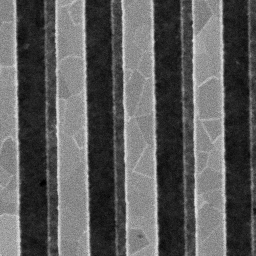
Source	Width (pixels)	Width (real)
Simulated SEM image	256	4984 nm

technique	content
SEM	lines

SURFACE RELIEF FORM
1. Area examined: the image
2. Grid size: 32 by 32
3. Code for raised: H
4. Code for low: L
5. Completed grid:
HHLLLLHHHHHLLLHHHHHLLLLHHHHHLLLH
HHLLLLHHHHHLLLHHHHHLLLLHHHHHLLLH
HHLLLLHHHHHLLLHHHHHLLLLHHHHHLLLH
HHLLLLHHHHHLLLHHHHHLLLLHHHHHLLLH
HHLLLLHHHHHLLLHHHHHLLLLHHHHHLLLH
HHLLLLHHHHHLLLHHHHHLLLLHHHHHLLLH
HHLLLLHHHHHLLLHHHHHLLLLHHHHHLLLH
HHLLLLHHHHHLLLHHHHHLLLLHHHHHLLLH
HHLLLLHHHHHLLLHHHHHLLLLHHHHHLLLH
HHLLLLHHHHHLLLHHHHHLLLLHHHHHLLLH
HHLLLLHHHHHLLLHHHHHLLLLHHHHHLLLH
HHLLLLHHHHHLLLHHHHHLLLLHHHHHLLLH
HHLLLLHHHHHLLLHHHHHLLLLHHHHHLLLH
HHLLLLHHHHHLLLHHHHHLLLLHHHHHLLLH
HHLLLLHHHHHLLLHHHHHLLLLHHHHHLLLH
HHLLLLHHHHHLLLHHHHHLLLLHHHHHLLLH
HHLLLLHHHHHLLLHHHHHLLLLHHHHHLLLH
HHLLLLHHHHHLLLHHHHHLLLLHHHHHLLLH
HHLLLLHHHHHLLLHHHHHLLLLHHHHHLLLH
HHLLLLHHHHHLLLHHHHHLLLLHHHHHLLLH
HHLLLLHHHHHLLLHHHHHLLLLHHHHHLLLH
HHLLLLHHHHHLLLHHHHHLLLLHHHHHLLLH
HHLLLLHHHHHLLLHHHHHHLLLHHHHHLLLL
HHLLLLHHHHHLLLHHHHHHLLLHHHHHLLLH
HHLLLLHHHHHLLLHHHHHHLLLHHHHHLLLL
HHLLLLHHHHHLLLHHHHHHLLLHHHHHLLLL
HHLLLLHHHHHLLLLHHHHHLLLHHHHHLLLL
HHLLLLHHHHHLLLLHHHHHLLLHHHHHLLLL
HHLLLLHHHHHLLLLHHHHHLLLHHHHHLLLL
HHLLLLHHHHHLLLLHHHHHLLLHHHHHLLLL
HHLLLLHHHHHLLLLHHHHHLLLHHHHHLLLL
HHLLLLHHHHHLLLLHHHHHLLLHHHHHLLLL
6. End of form